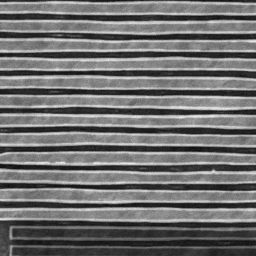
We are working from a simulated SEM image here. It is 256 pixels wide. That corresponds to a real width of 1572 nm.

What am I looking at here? parallel lines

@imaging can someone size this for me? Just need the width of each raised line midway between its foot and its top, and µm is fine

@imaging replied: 0.0691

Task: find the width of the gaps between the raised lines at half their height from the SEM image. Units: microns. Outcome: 0.0476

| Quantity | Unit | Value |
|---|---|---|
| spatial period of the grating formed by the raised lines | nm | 115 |